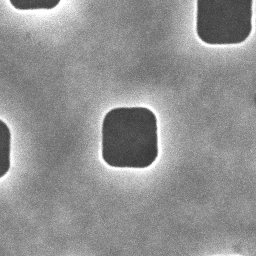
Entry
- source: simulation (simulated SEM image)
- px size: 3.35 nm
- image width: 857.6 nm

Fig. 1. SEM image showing holes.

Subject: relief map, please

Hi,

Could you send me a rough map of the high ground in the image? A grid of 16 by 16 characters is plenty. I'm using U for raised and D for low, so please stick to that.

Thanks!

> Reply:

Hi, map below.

UDDUUUUUUUUUDDDD
UUUUUUUUUUUUDDDD
UUUUUUUUUUUUUDDU
UUUUUUUUUUUUUUUU
UUUUUUUUUUUUUUUU
UUUUUUUUUUUUUUUU
UUUUUUUUUUUUUUUU
UUUUUUDDDDUUUUUU
DUUUUUDDDDUUUUUU
DUUUUUDDDDUUUUUU
DUUUUUUUDUUUUUUU
UUUUUUUUUUUUUUUU
UUUUUUUUUUUUUUUU
UUUUUUUUUUUUUUUU
UUUUUUUUUUUUUUUU
UUUUUUUUUUUUUUUU